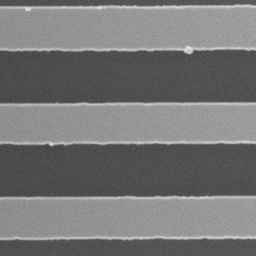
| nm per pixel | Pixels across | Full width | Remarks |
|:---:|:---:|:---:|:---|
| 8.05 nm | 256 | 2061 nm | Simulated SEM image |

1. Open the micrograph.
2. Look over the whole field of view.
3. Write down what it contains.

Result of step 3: lines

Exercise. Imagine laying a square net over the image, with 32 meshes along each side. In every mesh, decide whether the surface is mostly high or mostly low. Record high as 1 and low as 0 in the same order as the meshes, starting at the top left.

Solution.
00000000000000000000000000000000
11111111111111111111111111111111
11111111111111111111111111111111
11111111111111111111111111111111
11111111111111111111111111111111
11111111111111111111111111111111
00000000000000000000000100000000
00000000000000000000000000000000
00000000000000000000000000000000
00000000000000000000000000000000
00000000000000000000000000000000
00000000000000000000000000000000
00000000000000000000000000000000
11111111111111111111111111111111
11111111111111111111111111111111
11111111111111111111111111111111
11111111111111111111111111111111
11111111111111111111111111111111
00000000000000000000000000000000
00000000000000000000000000000000
00000000000000000000000000000000
00000000000000000000000000000000
00000000000000000000000000000000
00000000000000000000000000000000
00000000000000000000000000000000
11111111111111111111111111111111
11111111111111111111111111111111
11111111111111111111111111111111
11111111111111111111111111111111
11111111111111111111111111111111
00000000000000000000000000000000
00000000000000000000000000000000